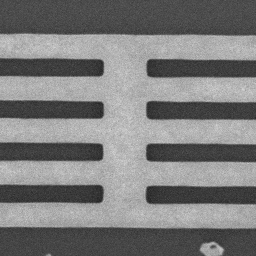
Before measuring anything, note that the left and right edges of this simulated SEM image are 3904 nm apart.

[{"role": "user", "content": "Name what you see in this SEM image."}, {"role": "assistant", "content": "groups of lines, slits or small figures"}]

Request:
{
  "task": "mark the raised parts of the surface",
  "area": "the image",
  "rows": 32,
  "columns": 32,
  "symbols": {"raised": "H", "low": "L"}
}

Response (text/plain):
LLLLLLLLLLLLLLLLLLLLLLLLLLLLLLLL
LLLLLLLLLLLLLLLLLLLLLLLLLLLLLLLL
LLLLLLLLLLLLLLLLLLLLLLLLLLLLLLLL
LLLLLLLLLLLLLLLLLLLLLLLLLLLLLLLL
HHHHHHHHHHHHHHHHHHHHHHHHHHHLLLLL
HHHHHHHHHHHHHHHHHHHHHHHHHHHHHHHH
HHHHHHHHHHHHHHHHHHHHHHHHHHHHHHHH
LLLLLLLLLLLLLHHHHHHLLLLLLLLLLLLL
LLLLLLLLLLLLLHHHHHLLLLLLLLLLLLLL
LLLLLLLLLLLLLHHHHHHLLLLLLLLLLLLL
HHHHHHHHHHHHHHHHHHHHHHHHHHHHHHHH
HHHHHHHHHHHHHHHHHHHHHHHHHHHHHHHH
LLLLLLLLLHHHHHHHHHHHHHHHHHHHHHHH
LLLLLLLLLLLLLHHHHHLLLLLLLLLLLLLL
LLLLLLLLLLLLLHHHHHLLLLLLLLLLLLLL
HHHHHHHHHHHHHHHHHHHHHHHHHHHHHHHH
HHHHHHHHHHHHHHHHHHHHHHHHHHHHHHHH
HHHHHHHHHHHHHHHHHHHHHHHHHHHHHHHH
LLLLLLLLLLLLLHHHHHLLLLLLLLLLLLLL
LLLLLLLLLLLLLHHHHHLLLLLLLLLLLLLL
HHHHHHHHHHHHHHHHHHHHHHHHHHHHHHHH
HHHHHHHHHHHHHHHHHHHHHHHHHHHHHHHH
HHHHHHHHHHHHHHHHHHHHHHHHHHHHHHHH
LLLLLLLLLLLLLHHHHHLLLLLLLLLLLLLL
LLLLLLLLLLLLLHHHHHLLLLLLLLLLLLLL
HHHHHHHHHHHHHHHHHHHLLLLLLLLLLLLL
HHHHHHHHHHHHHHHHHHHHHHHHHHHHHHHH
HHHHHHHHHHHHHHHHHHHHHHHHHHHHHHHH
LLLLLLLLLLLLLLLLLLLLLLLLLLLLLLLL
LLLLLLLLLLLLLLLLLLLLLLLLLLLLLLLL
LLLLLLLLLLLLLLLLLLLLLLLLLLHLLLLL
LLLLLLLLLLLLLLLLLLLLLLLLLLHLLLLL